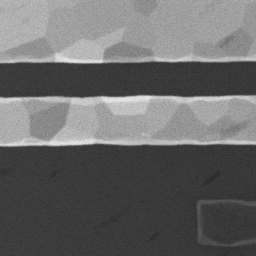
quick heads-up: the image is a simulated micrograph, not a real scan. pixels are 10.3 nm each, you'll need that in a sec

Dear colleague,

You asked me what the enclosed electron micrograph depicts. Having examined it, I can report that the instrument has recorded wiring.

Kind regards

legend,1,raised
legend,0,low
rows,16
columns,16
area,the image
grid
1111111111111111
1111111111111111
1111111111111111
1111111111111111
0000000000000000
0000000000000000
1111111111111111
1111111111111111
1111111111111111
0000000000000000
0000000000000000
0000000000000000
0000000000000000
0000000000001111
0000000000000111
0000000000000000